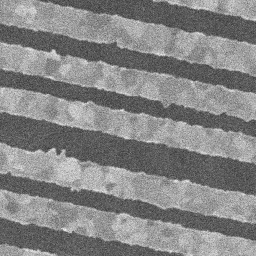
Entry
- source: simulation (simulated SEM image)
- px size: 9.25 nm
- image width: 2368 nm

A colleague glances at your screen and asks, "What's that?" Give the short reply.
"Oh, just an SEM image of parallel lines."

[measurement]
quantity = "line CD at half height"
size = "27 pixels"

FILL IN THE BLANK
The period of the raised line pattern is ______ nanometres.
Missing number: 448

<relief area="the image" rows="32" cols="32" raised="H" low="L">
HHHHHHHLLLLLLLLLLLLLLLHHHHHHHHHH
HHHHHHHHHHHLLLLLLLLLLLLLLLLHHHHH
HHHHHHHHHHHHHHHHHLLLLLLLLLLLLLLL
LLLHHHHHHHHHHHHHHHHHHLLLLLLLLLLL
LLLLLLLLLHHHHHHHHHHHHHHHHHLLLLLL
HLLLLLLLLLLLLLLHHHHHHHHHHHHHHHHL
HHHHHHHLLLLLLLLLLLHHHHHHHHHHHHHH
HHHHHHHHHHLLLLLLLLLLLLLHHHHHHHHH
HHHHHHHHHHHHHHHLLLLLLLLLLLLLHHHH
LLLLLHHHHHHHHHHHHHHHHLLLLLLLLLLL
LLLLLLLLLHHHHHHHHHHHHHHHHHLLLLLL
HHHHLLLLLLLLLLLHHHHHHHHHHHHHHHLL
HHHHHHHHLLLLLLLLLLLLHHHHHHHHHHHH
HHHHHHHHHHHHHLLLLLLLLLLLHHHHHHHH
LLLHHHHHHHHHHHHHHHHLLLLLLLLLLHHH
LLLLLLLHHHHHHHHHHHHHHHHLLLLLLLLL
LLLLLLLLLLLLLHHHHHHHHHHHHHHHLLLL
LLLLLLLLLLLLLLLLLHHHHHHHHHHHHHHH
HHLLLLLLLLLLLLLLLLLLLLLHHHHHHHHH
HHHHHHHHLLLLLLLLLLLLLLLLLLLLHHHH
HHHHHHHHHHHHLLLLLLLLLLLLLLLLLLLL
HHHHHHHHHHHHHHHHLLLLLLLLLLLLLLLL
LLLLLHHHHHHHHHHHHHHHHLLLLLLLLLLL
LLLLLLLLLHHHHHHHHHHHHHHHHHLLLLLL
HHHHLLLLLLLLLLHHHHHHHHHHHHHHHHHH
HHHHHHHHHLLLLLLLLLLHHHHHHHHHHHHH
HHHHHHHHHHHHHLLLLLLLLLLLHHHHHHHH
LHHHHHHHHHHHHHHHHHHLLLLLLLLLLLHH
LLLLLLHHHHHHHHHHHHHHHHHLLLLLLLLL
LLLLLLLLLLLHHHHHHHHHHHHHHHHHLLLL
LLLLLLLLLLLLLLLLHHHHHHHHHHHHHHHH
HHHHHLLLLLLLLLLLLLLLLLHHHHHHHHHH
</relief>